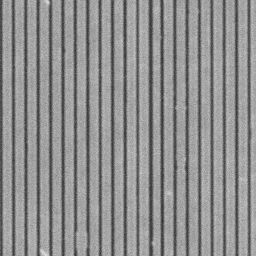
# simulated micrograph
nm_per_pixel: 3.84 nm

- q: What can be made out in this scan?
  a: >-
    parallel lines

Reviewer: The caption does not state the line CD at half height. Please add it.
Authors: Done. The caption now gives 8.85 px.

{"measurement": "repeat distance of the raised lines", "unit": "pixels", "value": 12.4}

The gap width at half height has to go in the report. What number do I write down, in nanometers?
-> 13.4